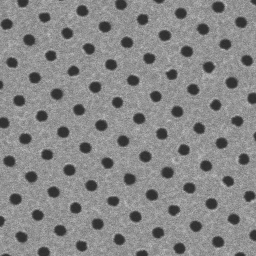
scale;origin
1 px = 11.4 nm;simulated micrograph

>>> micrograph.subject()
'a regular array of holes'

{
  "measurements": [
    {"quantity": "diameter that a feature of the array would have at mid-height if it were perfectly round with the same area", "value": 139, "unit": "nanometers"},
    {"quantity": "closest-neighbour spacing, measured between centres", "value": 307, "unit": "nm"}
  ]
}